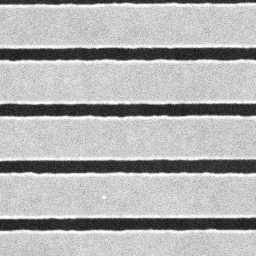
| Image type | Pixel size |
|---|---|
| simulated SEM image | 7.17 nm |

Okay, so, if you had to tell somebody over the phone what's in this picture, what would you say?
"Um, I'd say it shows lines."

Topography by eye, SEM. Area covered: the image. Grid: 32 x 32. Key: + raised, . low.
..............+++...++.+.++..+++
++++++++++++++++++++++++++++++++
++++++++++++++++++++++++++++++++
++++++++++++++++++++++++++++++++
++++++++++++++++++++++++++++++++
++++++++++++++++++++++++++++++++
................................
.............+......+.........+.
++++++++++++++++++++++++++++++++
++++++++++++++++++++++++++++++++
++++++++++++++++++++++++++++++++
++++++++++++++++++++++++++++++++
++++++++++++++++++++++++++++++++
................................
................................
++++++++++++++++++++++++++++++++
++++++++++++++++++++++++++++++++
++++++++++++++++++++++++++++++++
++++++++++++++++++++++++++++++++
++++++++++++++++++++++++++++++++
................................
................................
++++++++++++++++++++++++++++++++
++++++++++++++++++++++++++++++++
++++++++++++++++++++++++++++++++
++++++++++++++++++++++++++++++++
++++++++++++++++++++++++++++++++
................................
................................
++++++++++++++++++++++++++++++++
++++++++++++++++++++++++++++++++
++++++++++++++++++++++++++++++++